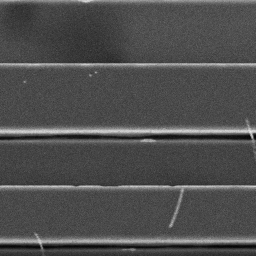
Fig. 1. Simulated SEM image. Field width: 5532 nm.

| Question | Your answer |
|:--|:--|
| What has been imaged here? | lines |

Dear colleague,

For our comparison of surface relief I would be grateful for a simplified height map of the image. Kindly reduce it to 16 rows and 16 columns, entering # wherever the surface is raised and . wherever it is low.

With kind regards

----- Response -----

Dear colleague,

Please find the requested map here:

................
................
................
................
################
################
################
################
................
................
................
................
################
################
################
................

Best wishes